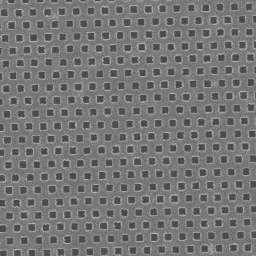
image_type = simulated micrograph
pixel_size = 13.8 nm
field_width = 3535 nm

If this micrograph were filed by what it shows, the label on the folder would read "a regular array of holes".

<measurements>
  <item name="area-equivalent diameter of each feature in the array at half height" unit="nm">103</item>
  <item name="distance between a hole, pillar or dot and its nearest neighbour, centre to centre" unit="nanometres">194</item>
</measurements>